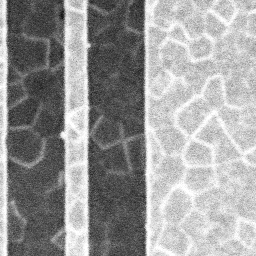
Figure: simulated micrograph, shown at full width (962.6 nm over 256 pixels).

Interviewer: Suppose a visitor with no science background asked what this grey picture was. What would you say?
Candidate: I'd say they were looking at one or a few lines or trenches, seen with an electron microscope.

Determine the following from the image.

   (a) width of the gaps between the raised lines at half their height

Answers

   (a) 230 nanometers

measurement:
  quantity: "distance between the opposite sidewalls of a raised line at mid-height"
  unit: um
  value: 0.0734